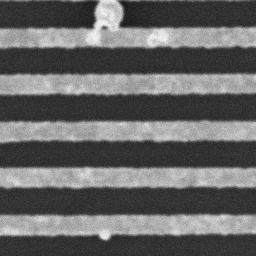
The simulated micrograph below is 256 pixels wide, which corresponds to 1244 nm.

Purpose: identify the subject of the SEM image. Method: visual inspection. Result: lines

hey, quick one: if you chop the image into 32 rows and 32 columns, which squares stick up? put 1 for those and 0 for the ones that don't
00000000000011100000000000000000
00000000000011100000000000000000
00000000000011100000000000000000
00000000000011100000000000000101
11111111111111111111111111111111
11111111111111111111111111111111
00000000000000000000000000000000
00000000000000000000000000000000
00000000000000000000000000000000
11111111111111111111111111111111
11111111111111111111111111111111
11111111111111111111111111111111
00000000000000000000000000000000
00000000000000000000000000000000
00000000000000000000000000000000
11111111111111111111111111111111
11111111111111111111111111111111
11110111111111111101111110111111
00000000000000000000000000000000
00000000000000000000000000000000
00000000000000000000000000000000
11111111111111111111111111111111
11111111111111111111111111111111
00000000000000000000000000000000
00000000000000000000000000000000
00000000000000000000000000000000
00000000000000000000000000000000
11111111111111111111111111111111
11111111111111111111111111111111
00000000000011000000000000000000
00000000000000000000000000000000
00000000000000000000000000000000